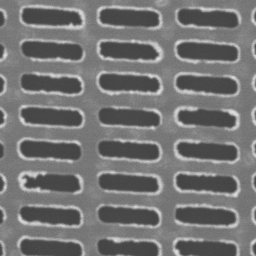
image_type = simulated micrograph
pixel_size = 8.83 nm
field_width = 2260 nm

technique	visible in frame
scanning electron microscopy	a regular array of holes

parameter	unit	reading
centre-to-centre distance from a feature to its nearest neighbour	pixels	32.8